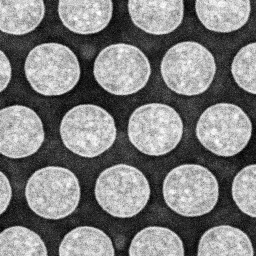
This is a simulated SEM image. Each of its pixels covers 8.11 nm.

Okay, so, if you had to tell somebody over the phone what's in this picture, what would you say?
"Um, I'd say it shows a regular array of raised bodies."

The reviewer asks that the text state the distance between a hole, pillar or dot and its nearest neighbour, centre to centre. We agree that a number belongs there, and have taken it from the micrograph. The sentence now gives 68.7 px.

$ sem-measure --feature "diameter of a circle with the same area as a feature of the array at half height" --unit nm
425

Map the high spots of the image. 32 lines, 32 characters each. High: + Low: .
+++++...++++++..+++++++..++++++.
+++++..+++++++..+++++++..++++++.
+++++...++++++...++++++..++++++.
++++.....++++.....++++....++++..
................................
.......................+.......+
....+++++....+++++...+++++....++
+..++++++...++++++..+++++++..+++
+..+++++++..+++++++.+++++++..+++
+..+++++++..+++++++.+++++++..+++
+...+++++....+++++...+++++....++
.....+++......+++.....+++.......
................................
.++.......++.....++++.....++++..
+++++...++++++..++++++...++++++.
+++++...++++++..+++++++..++++++.
+++++...++++++..+++++++..++++++.
+++++...++++++...+++++...++++++.
+++++....++++....+++++....++++..
.++.............................
................................
.....++++....++++....+++++....++
+...+++++...++++++...++++++..+++
+..+++++++..++++++...++++++..+++
+..+++++++..++++++...++++++..+++
+...++++++...+++++...++++++...++
....+++++....++++.....++++.....+
................................
..+.......+................++...
+++++...+++++....+++++...++++++.
+++++...++++++..+++++++..++++++.
++++++..++++++..+++++++..+++++++